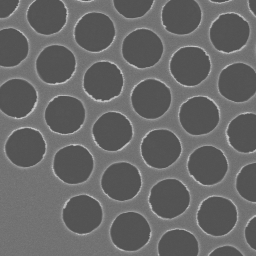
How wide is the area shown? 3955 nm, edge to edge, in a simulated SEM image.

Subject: a regular array of holes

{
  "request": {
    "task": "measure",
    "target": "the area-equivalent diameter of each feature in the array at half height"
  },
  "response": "0.602 µm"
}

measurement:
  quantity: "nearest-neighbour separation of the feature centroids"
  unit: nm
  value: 780